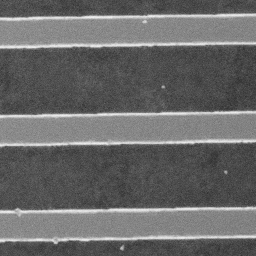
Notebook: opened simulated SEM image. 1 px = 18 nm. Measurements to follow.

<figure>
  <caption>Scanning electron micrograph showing lines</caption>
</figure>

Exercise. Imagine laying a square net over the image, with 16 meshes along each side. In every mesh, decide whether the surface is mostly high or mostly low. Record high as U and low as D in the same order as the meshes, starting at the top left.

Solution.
DDDDDDDDDDDDDDDD
UUUUUUUUUUUUUUUU
UUUUUUUUUUUUUUUU
DDDDDDDDDDDDDDDD
DDDDDDDDDDDDDDDD
DDDDDDDDDDDDDDDD
DDDDDDDDDDDDDDDD
UUUUUUUUUUUUUUUU
UUUUUUUUUUUUUUUU
DDDDDDDDDDDDDDDD
DDDDDDDDDDDDDDDD
DDDDDDDDDDDDDDDD
DDDDDDDDDDDDDDDD
UUUUUUUUUUUUUUUU
UUUUUUUUUUUUUUUU
DDDDDDDDDDDDDDDD